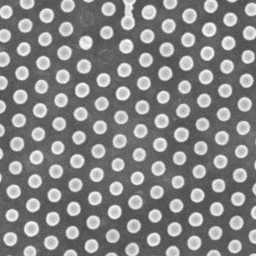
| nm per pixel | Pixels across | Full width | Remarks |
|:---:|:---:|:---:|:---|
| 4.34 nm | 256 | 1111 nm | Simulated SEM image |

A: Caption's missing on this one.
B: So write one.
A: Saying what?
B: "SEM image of a regular array of raised bodies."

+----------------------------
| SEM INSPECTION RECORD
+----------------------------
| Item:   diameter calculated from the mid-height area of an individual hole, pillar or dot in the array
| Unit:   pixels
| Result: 12.8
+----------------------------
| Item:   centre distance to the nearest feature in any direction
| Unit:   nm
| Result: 101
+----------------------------